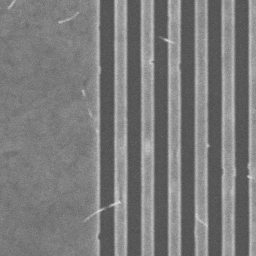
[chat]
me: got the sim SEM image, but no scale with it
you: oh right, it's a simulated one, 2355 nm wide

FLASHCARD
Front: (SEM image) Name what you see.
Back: parallel lines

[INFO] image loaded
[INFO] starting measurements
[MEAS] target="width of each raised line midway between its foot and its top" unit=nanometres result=107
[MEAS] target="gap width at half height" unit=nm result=144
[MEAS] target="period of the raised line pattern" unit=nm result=248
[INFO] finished